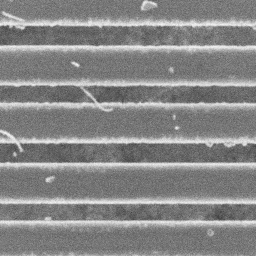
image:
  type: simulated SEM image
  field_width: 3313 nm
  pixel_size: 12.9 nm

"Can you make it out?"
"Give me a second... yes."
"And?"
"lines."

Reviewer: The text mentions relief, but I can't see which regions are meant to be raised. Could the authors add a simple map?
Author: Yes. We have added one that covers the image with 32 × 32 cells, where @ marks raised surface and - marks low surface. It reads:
@@@@@@@@@@@@@@@@@@@@@@@@@@@@@@@@
@@@@@@@@@@@@@@@@@@@@@@@@@@@@@@@@
@@@@@@@@@@@@@@@@@@@@@@@@@@@@@@@@
--------------------------------
--------------------------------
--------------------------------
@@@@@@@@@@@@@@@@@@@@@@@@@@@@@@@@
@@@@@@@@@@@@@@@@@@@@@@@@@@@@@@@@
@@@@@@@@@@@@@@@@@@@@@@@@@@@@@@@@
@@@@@@@@@@@@@@@@@@@@@@@@@@@@@@@@
--@---@------------------------@
--------------------------------
--------------------------------
@@@@@@@@@@@@@@@@@@@@@@@@@@@@@@@@
@@@@@@@@@@@@@@@@@@@@@@@@@@@@@@@@
@@@@@@@@@@@@@@@@@@@@@@@@@@@@@@@@
@@@@@@@@@@@@@@@@@@@@@@@@@@@@@@@@
@@@@@@@@@@@@@@@@@@@@@@@@@@@@@@@@
--------------------------------
--------------------------------
--------------------------------
@@@@@@@@@@@@@@@@@@@@@@@@@@@@@@@@
@@@@@@@@@@@@@@@@@@@@@@@@@@@@@@@@
@@@@@@@@@@@@@@@@@@@@@@@@@@@@@@@@
@@@@@@@@@@@@@@@@@@@@@@@@@@@@@@@@
--------------------------------
--------------------------------
--------------------------------
@@@@@@@@@@@@@@@@@@@@@@@@@@@@@@@@
@@@@@@@@@@@@@@@@@@@@@@@@@@@@@@@@
@@@@@@@@@@@@@@@@@@@@@@@@@@@@@@@@
@@@@@@@@@@@@@@@@@@@@@@@@@@@@@@@@